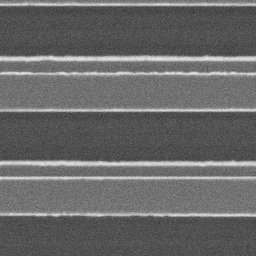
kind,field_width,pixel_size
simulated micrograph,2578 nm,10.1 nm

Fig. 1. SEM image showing lines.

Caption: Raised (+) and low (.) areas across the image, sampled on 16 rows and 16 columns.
................
................
................
................
++++++++++++++++
++++++++++++++++
++++++++++++++++
................
................
................
++++++++++++++++
++++++++++++++++
++++++++++++++++
................
................
................